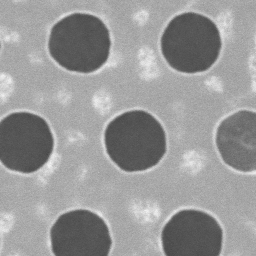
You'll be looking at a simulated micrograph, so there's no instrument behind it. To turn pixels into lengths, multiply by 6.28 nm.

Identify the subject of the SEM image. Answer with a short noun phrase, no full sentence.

holes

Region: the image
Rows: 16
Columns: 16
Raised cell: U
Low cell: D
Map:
UUUUUUUUUUUUUUUU
UUUDDDDUUUUDDUUU
UUUDDDDUUUDDDDUU
UUUDDDDUUUDDDDUU
UUUUUDUUUUUDDUUU
UUUUUUUUUUUUUUUU
UUUUUUUUUUUUUUUU
DDDUUUUDDDUUUUDD
DDDUUUUDDDUUUDDD
DDDUUUUDDDUUUUDD
UDDUUUUDDUUUUUUD
UUUUUUUUUUUUUUUU
UUUUUUUUUUUUUUUU
UUUUDDUUUUUDDUUU
UUUDDDDUUUDDDDUU
UUUDDDDUUUDDDDUU